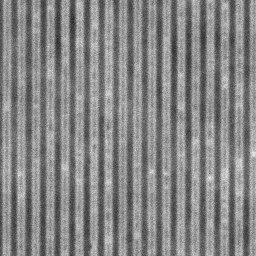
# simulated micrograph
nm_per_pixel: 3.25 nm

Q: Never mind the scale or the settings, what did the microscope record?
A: parallel lines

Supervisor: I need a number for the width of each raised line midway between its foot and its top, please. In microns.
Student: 0.0207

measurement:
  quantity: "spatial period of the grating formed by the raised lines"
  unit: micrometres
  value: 0.0472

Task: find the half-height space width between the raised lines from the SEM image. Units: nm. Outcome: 26.8